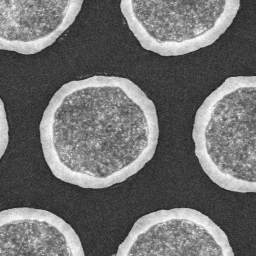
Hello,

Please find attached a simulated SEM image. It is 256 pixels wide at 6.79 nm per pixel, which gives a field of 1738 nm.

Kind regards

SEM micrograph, raised bodies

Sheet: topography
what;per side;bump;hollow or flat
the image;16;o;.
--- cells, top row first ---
ooooo...oooooo..
oooo....oooooo..
ooo......oooo...
................
................
....oooo......oo
...oooooo....ooo
...ooooooo...ooo
...ooooooo..oooo
...oooooo....ooo
....oooo.....ooo
..............oo
................
ooo.......oo....
oooo....ooooo...
ooooo...oooooo..